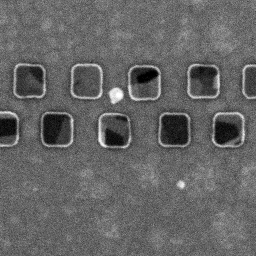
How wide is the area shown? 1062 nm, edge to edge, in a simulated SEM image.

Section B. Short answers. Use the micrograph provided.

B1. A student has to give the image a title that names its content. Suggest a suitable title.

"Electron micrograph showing a regular array of raised bodies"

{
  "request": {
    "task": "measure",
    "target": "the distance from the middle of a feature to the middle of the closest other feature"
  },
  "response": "230 nanometers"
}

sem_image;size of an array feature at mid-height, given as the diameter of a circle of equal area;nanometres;147